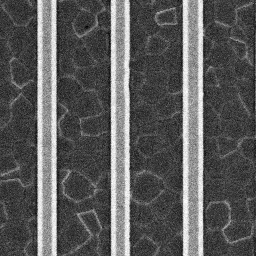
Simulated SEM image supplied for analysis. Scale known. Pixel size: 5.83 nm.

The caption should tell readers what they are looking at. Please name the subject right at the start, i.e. one or a few lines or trenches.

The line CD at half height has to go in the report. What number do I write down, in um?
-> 0.0897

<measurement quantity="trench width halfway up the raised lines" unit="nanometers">338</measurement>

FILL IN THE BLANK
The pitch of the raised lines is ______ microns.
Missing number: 0.426